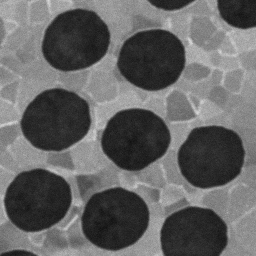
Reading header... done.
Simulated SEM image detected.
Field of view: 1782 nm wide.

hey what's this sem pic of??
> holes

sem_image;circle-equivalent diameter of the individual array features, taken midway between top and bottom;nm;460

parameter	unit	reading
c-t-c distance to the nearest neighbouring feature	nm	549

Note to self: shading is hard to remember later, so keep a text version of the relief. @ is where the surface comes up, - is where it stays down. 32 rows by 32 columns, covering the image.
@@@@@@@@@@@@@@@@@@@-----@@@-----
@@@@@@@@----@@@@@@@@@@@@@@@-----
@@@@@@@------@@@@@@@@@@@@@@@----
@@@@@@--------@@@@@@@@@@@@@@@---
@@@@@---------@@------@@@@@@@@@@
@@@@@---------@--------@@@@@@@@@
@@@@@--------@@--------@@@@@@@@@
@@@@@@-------@@--------@@@@@@@@@
@@@@@@@----@@@@--------@@@@@@@@@
@@@@@@@@@@@@@@@--------@@@@@@@@@
@@@@@@@@@@@@@@@@------@@@@@@@@@@
@@@@@----@@@@@@@@@@@@@@@@@@@@@@@
@@@@-------@@@@@@@@@@@@@@@@@@@@@
@@@--------@@@@@-@@@@@@@@@@@@@@@
@@@--------@@@------@@@@@@@@@@@@
@@@--------@@--------@@@@@@@@@@@
@@@--------@@--------@@@-----@@@
@@@-------@@@--------@@-------@@
@@@@-----@@@@--------@---------@
@@@@@@@@@@@@@-------@@---------@
@@@@@@@@@@@@@@-----@@@--------@@
@@@----@@@@@@@@@@@@@@@@-------@@
@@------@@@@@@@@@@@@@@@------@@@
@--------@@@@@-@@@@@@@@@@--@@@@@
---------@@-------@@@@@@@@@@@@@@
---------@@-------@@@@@@@@@@@@@@
@-------@@---------@@@-----@@@@@
@-------@@---------@@-------@@@@
@@----@@@@--------@@--------@@@@
@@@@@@@@@@@-------@@--------@@@@
@@@@@@@@@@@@-----@@@--------@@@@
----@@@@@@@@@@@@@@@@--------@@@@